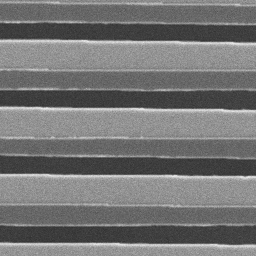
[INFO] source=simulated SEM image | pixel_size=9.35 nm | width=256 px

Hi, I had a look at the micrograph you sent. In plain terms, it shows lines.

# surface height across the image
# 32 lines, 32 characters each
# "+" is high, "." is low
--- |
++++++++++++++++++++++++++++++++
++++++++++++++++++++++++++++++++
++++++++++++++++++++++++++++++++
................................
................................
++++++++++++++++++++++++++++++++
++++++++++++++++++++++++++++++++
++++++++++++++++++++++++++++++++
++++++++++++++++++++++++++++++++
++++++++++++++++++++++++++++++++
++++++++++++++++++++++++++++++++
................................
................................
++++++..........................
++++++++++++++++++++++++++++++++
++++++++++++++++++++++++++++++++
++++++++++++++++++++++++++++++++
++++++++++++++++++++++++++++++++
++++++++++++++++++++++++++++++++
........++++++++++++++++++++++++
................................
................................
++++++++++++++++++++++++++++++++
++++++++++++++++++++++++++++++++
++++++++++++++++++++++++++++++++
++++++++++++++++++++++++++++++++
++++++++++++++++++++++++++++++++
++++++++++++++++++++++++++++++++
................................
................................
++++++++++++++++................
++++++++++++++++++++++++++++++++